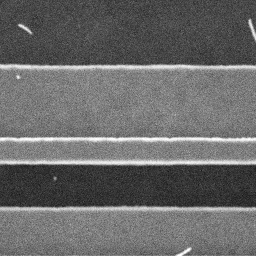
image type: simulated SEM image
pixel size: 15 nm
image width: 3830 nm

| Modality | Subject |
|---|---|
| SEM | lines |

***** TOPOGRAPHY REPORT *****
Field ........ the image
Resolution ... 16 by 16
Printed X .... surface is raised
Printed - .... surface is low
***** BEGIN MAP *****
----------------
----------------
----------------
----------------
XXXXXXXXXXXXXXXX
XXXXXXXXXXXXXXXX
XXXXXXXXXXXXXXXX
XXXXXXXXXXXXXXXX
XXXXXXXXXXXXXXXX
XXXXXXXXXXXXXXXX
----------------
----------------
----------------
XXXXXXXXXXXXXXXX
XXXXXXXXXXXXXXXX
XXXXXXXXXXXXXXXX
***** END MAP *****